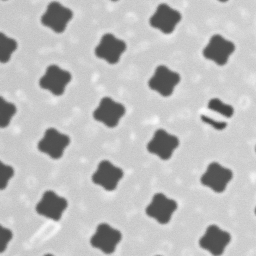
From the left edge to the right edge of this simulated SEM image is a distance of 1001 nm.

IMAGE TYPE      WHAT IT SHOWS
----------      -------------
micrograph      a regular array of holes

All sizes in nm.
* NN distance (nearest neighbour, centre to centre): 245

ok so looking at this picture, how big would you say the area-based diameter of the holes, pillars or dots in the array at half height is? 113 nanometers